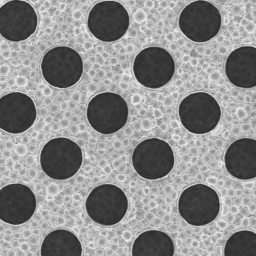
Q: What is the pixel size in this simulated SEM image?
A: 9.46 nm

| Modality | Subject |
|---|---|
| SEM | a regular array of holes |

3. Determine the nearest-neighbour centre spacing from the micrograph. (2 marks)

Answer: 612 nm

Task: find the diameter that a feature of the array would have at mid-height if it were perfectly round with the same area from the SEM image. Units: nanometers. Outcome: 396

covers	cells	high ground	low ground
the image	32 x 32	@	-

@---@@@@@@@@---@@@@@@@@@--@@@@@@
----@@@@@@@-----@@@@@@@----@@@@@
-----@@@@@@-----@@@@@@------@@@@
-----@@@@@@-----@@@@@@@----@@@@@
----@@@@@@@@---@@@@@@@@----@@@@@
@@@@@@@@@@@@@@@@@@@@@@@@@@@@@@@@
@@@@@@----@@@@@@@@---@@@@@@@@---
@@@@@-----@@@@@@@-----@@@@@@----
@@@@@-----@@@@@@@-----@@@@@@----
@@@@@-----@@@@@@@-----@@@@@@----
@@@@@@---@@@@@@@@@---@@@@@@@@---
@@@@@@@@@@@@@@@@@@@@@@@@@@@@@@@@
----@@@@@@@-----@@@@@@@----@@@@@
----@@@@@@@-----@@@@@@------@@@@
-----@@@@@@-----@@@@@@------@@@@
----@@@@@@@-----@@@@@@@----@@@@@
@--@@@@@@@@@--@@@@@@@@@@--@@@@@@
@@@@@@---@@@@@@@@@--@@@@@@@@@@--
@@@@@-----@@@@@@@----@@@@@@@@---
@@@@@-----@@@@@@@-----@@@@@@----
@@@@@-----@@@@@@@-----@@@@@@----
@@@@@@----@@@@@@@----@@@@@@@@---
@@@@@@@@@@@@@@@@@@@@@@@@@@@@@@@@
----@@@@@@@@---@@@@@@@@@--@@@@@@
----@@@@@@@-----@@@@@@@----@@@@@
-----@@@@@@-----@@@@@@-----@@@@@
----@@@@@@@-----@@@@@@-----@@@@@
---@@@@@@@@@---@@@@@@@@----@@@@@
@@@@@@@@@@@@@@@@@@@@@@@@@@@@@@@@
@@@@@@---@@@@@@@@----@@@@@@@@---
@@@@@-----@@@@@@@-----@@@@@@----
@@@@@-----@@@@@@------@@@@@@----